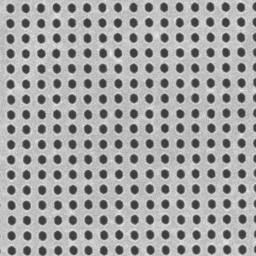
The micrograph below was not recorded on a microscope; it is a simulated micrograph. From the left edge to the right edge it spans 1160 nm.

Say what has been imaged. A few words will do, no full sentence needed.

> a regular array of holes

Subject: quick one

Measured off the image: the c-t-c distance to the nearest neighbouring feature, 67.5 nm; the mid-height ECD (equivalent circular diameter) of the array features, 41.2 nanometers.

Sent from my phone